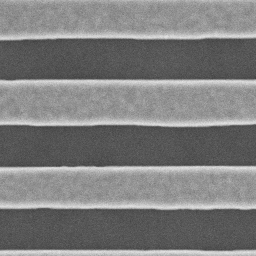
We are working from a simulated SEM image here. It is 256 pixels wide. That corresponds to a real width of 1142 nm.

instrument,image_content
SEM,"lines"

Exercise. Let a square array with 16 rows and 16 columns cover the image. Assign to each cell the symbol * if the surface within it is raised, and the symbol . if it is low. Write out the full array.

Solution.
****************
****************
................
................
................
****************
****************
****************
................
................
****************
****************
****************
................
................
................